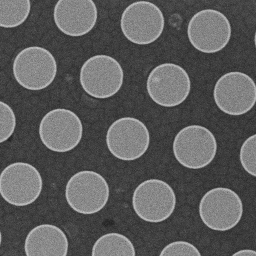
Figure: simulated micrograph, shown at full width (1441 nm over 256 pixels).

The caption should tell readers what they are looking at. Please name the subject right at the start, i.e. an array of small figures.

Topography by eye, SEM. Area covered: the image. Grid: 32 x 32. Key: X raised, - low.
XXXX---XXXXX-----XX-------------
XXXX---XXXXX---XXXXX-----XX-----
XXX----XXXXX---XXXXX----XXXX----
-------XXXX----XXXXX----XXXXX---
----------------XXXX----XXXXX---
-----------------X------XXXX----
---XXX-------------------XX-----
--XXXXX----XXX------------------
--XXXXX---XXXXX-----XXX---------
--XXXXX---XXXXX----XXXXX----XXX-
---XXX----XXXXX---XXXXXX---XXXXX
-----------XXXX----XXXXX---XXXXX
-------------------XXXX----XXXXX
X--------------------------XXXX-
XX----XXXX----------------------
XX---XXXXX----XXXX--------------
XX---XXXXX---XXXXXX---XXXX------
X----XXXXX---XXXXXX---XXXXX----X
------XXX-----XXXX----XXXXX---XX
--------------XXX-----XXXXX---XX
--X--------------------XXX----XX
XXXXX-----XX-------------------X
XXXXX----XXXX------X------------
XXXXX---XXXXXX---XXXX------X----
XXXXX---XXXXXX---XXXXX---XXXXX--
--XX-----XXXX----XXXXX---XXXXX--
----------XX-----XXXXX---XXXXX--
------------------XX-----XXXXX--
----XXX-------------------XXX---
---XXXXX-----XX-----------------
---XXXXX----XXXX-----XXX--------
---XXXXX----XXXXX---XXXXX-----XX